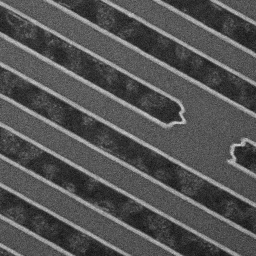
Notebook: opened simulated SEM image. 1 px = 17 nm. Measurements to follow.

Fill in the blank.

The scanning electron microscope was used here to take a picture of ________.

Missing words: parallel lines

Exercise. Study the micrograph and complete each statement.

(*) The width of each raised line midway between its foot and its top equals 458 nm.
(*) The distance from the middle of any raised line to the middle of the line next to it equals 900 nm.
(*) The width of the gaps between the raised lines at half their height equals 25.9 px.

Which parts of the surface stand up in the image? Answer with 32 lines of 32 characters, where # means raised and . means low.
.......#######.......######.....
##.......#######......#######...
####.......######.......#######.
######......#######.......######
.######.......#######.......####
..#######.......#######.......##
....#######.......#######......#
......#######.......######......
#.......#######......#######....
###.......######.......#######..
#####......#######.......#######
######.......#######.......#####
.#######.......#######.......###
...#######.......######.......##
.....#######.......####.........
.......#######......#...........
##......#######.................
####......#######...............
#####.......#######..........###
#######.......#######........###
..#######......########......###
....#######......#######.......#
.....########......#######......
#......#######.......#######....
###......#######.......#######..
####.......#######......########
######.......#######......######
.#######......########......####
...#######......#######.......##
....########......#######.......
......#######.......#######.....
##......#######.......#######...